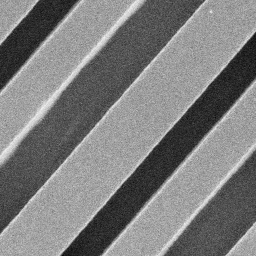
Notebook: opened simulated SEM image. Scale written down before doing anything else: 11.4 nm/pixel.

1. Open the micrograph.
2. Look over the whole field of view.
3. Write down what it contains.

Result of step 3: lines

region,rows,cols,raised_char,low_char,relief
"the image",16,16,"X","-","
XX---XXX----XXXX
X---XXX-----XXXX
---XXX-----XXXXX
--XXXX----XXXXX-
-XXXX----XXXXX--
XXXX----XXXXX---
XXX----XXXXX---X
XX----XXXXX---XX
X----XXXXX---XXX
-----XXXX---XXXX
----XXXXX--XXXX-
---XXXXX--XXXX--
--XXXXX--XXXX---
-XXXXX---XXX----
XXXXX---XXX----X
XXXX---XXX-----X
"